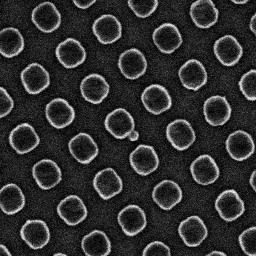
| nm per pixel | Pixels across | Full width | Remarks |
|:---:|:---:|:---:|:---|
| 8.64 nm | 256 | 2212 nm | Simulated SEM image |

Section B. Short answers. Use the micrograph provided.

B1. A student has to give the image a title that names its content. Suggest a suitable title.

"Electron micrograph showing a regular array of raised bodies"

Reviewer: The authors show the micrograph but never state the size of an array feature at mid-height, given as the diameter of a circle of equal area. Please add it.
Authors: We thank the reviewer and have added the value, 241 nm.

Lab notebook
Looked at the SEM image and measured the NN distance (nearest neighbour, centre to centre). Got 0.369 microns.